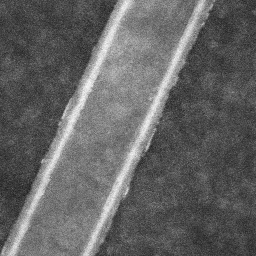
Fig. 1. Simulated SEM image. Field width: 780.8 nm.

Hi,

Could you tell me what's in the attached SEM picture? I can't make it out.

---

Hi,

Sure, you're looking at one or a few lines or trenches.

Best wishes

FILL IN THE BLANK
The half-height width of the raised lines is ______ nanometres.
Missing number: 209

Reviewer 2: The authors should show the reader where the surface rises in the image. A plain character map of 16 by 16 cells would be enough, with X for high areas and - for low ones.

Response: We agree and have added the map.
--------XXXX----
-------XXXXX----
-------XXXXX----
------XXXXX-----
------XXXXX-----
-----XXXXX------
-----XXXXX------
-----XXXX-------
----XXXXX-------
----XXXX--------
---XXXXX--------
---XXXX---------
--XXXXX---------
--XXXX----------
-XXXXX----------
-XXXXX----------